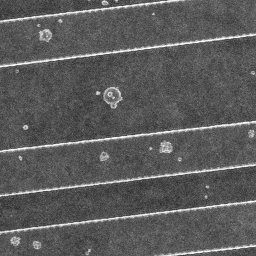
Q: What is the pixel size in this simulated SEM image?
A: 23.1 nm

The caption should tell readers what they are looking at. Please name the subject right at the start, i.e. lines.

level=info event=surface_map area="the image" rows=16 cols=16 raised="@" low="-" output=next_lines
-------@@@@@@@@@
@@@@@@@@@@@@@@@@
@@@@@@@@@@@@@---
@@@@@-----------
----------------
----------------
----------------
----------------
--------@@@@@@@@
@@@@@@@@@@@@@@@@
@@@@@@@@@@@@@@@-
@@@@@@----------
----------------
--------@@@@@@@@
@@@@@@@@@@@@@@@@
@@@@@@@@@@@@@@@-